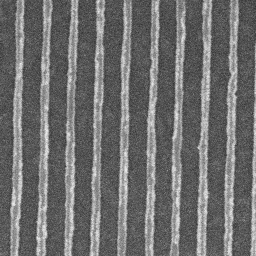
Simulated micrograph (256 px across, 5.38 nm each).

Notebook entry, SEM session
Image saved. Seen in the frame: parallel lines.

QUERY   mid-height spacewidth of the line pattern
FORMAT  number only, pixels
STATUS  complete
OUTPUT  19.6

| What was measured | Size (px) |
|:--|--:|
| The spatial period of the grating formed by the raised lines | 26.7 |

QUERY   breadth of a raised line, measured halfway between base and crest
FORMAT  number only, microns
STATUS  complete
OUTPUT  0.0383